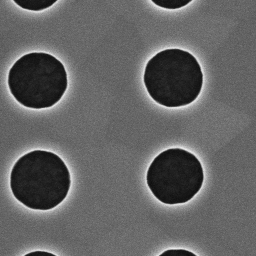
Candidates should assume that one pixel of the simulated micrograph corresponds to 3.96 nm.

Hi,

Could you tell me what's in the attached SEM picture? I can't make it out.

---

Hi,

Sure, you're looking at holes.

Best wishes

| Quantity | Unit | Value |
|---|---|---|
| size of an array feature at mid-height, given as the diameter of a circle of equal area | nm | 230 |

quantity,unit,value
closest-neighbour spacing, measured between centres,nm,393